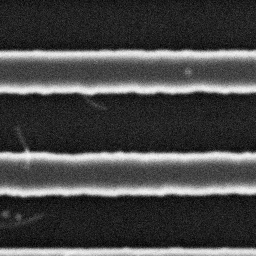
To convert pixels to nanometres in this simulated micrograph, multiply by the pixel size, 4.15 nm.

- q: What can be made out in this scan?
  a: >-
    lines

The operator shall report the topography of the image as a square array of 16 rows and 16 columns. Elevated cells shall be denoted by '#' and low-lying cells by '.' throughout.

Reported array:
................
................
................
################
################
################
................
................
................
................
################
################
................
................
................
................